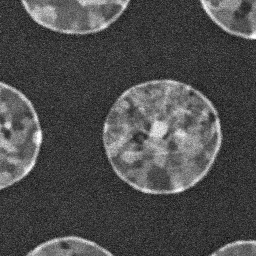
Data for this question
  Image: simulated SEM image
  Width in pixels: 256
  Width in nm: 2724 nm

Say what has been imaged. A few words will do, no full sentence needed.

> raised bodies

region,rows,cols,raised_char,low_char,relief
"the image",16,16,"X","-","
--XXXXXX-----XXX
---XXXX-------XX
----------------
----------------
----------------
X-------XXXX----
XX-----XXXXXX---
XX-----XXXXXXX--
XX-----XXXXXXX--
XX-----XXXXXXX--
XX-----XXXXXX---
X-------XXXX----
----------------
----------------
----------------
--XXXX--------XX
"